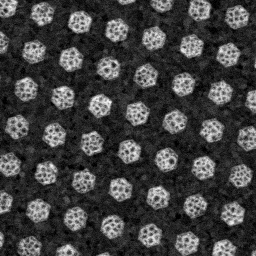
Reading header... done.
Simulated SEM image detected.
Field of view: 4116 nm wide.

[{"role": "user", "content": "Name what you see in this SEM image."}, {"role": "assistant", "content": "a regular array of holes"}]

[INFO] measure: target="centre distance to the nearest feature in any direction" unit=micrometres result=0.607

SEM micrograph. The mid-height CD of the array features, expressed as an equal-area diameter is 20.5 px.